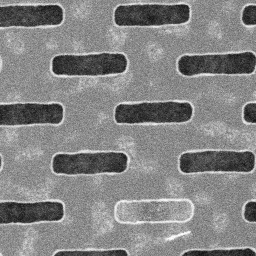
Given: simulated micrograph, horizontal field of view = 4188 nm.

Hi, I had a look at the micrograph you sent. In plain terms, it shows holes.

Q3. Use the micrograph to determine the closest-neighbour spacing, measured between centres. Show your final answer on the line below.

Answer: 1300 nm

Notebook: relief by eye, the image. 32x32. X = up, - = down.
XXXXXXXXXXXXXXXXX---XXXXXXXXXXXX
--------XXXXXX----------XXXXXX--
--------XXXXXX---------XXXXXXX--
XXXXXXXXXXXXXXXXXXXXXXXXXXXXXXXX
XXXXXXXXXXXXXXXXXXXXXXXXXXXXXXXX
XXXXXXXXXXXXXXXXXXXXXXXXXXXXXXXX
XXXXXXXXXXXXXXXXXXXXXXXXXXXXXXXX
XXXXXXX---------XXXXXX----------
XXXXXXX---------XXXXXX----------
XXXXXXXXXXXXXXXXXXXXXXX-XXXXXXXX
XXXXXXXXXXXXXXXXXXXXXXXXXXXXXXXX
XXXXXXXXXXXXXXXXXXXXXXXXXXXXXXXX
XXXXXXXXXXXXXXXXXXXXXXXXXXXXXXXX
--------XXXXXXX---------XXXXXXX-
--------XXXXXX----------XXXXXX--
-------XXXXXXXXXXXXXXXXXXXXXXXXX
XXXXXXXXXXXXXXXXXXXXXXXXXXXXXXXX
XXXXXXXXXXXXXXXXXXXXXXXXXXXXXXXX
XXXXXXXXXXXXXXXXXXXXXXXXXXXXXXXX
XXXXXXX---------XXXXXXX---------
XXXXXX----------XXXXXX----------
XXXXXXX--------XXXXXXXX---XX---X
XXXXXXXXXXXXXXXXXXXXXXXXXXXXXXXX
XXXXXXXXXXXXXXXXXXXXXXXXXXXXXXXX
XXXXXXXXXXXXXXXXXXXXXXXXXXXXXXXX
--------XXXXXXXXXX---XXXXXXXXXX-
--------XXXXXXXXX----XXXXXXXXX--
-------XXXXXXXXXXXXXXXXXXXXXXXX-
XXXXXXXXXXXXXXXXXXXXXXXXXXXXXXXX
XXXXXXXXXXXXXXXXXXXXXXXXXXXXXXXX
XXXXXXXXXXXXXXXXXXXXXXXXXXXXXXXX
XXXXXXX---------XXXXXXX---------